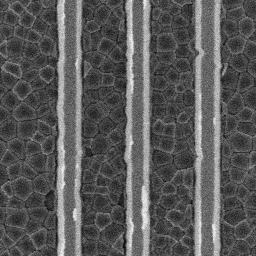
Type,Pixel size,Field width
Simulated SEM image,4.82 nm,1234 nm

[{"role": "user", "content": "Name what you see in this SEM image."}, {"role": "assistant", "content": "one or a few lines or trenches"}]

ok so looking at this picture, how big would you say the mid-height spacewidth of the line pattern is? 242 nm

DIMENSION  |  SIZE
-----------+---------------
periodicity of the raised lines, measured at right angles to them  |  332 nm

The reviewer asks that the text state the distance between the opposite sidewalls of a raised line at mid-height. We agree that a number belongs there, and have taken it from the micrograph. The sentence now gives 91 nm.